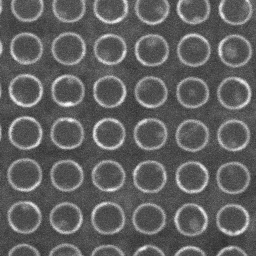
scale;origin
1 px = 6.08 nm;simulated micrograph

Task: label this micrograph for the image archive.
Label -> a regular array of raised bodies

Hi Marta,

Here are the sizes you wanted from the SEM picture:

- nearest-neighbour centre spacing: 252 nm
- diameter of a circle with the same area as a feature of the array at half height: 193 nm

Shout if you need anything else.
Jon